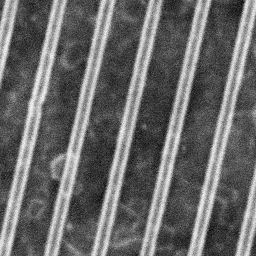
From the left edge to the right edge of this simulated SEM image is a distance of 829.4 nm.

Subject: parallel lines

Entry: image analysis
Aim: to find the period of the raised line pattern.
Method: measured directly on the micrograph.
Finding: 152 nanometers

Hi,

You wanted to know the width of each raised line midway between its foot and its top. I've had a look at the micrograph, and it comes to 35.5 nm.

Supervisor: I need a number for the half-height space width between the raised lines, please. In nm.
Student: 114